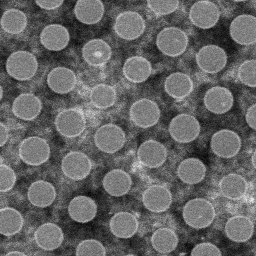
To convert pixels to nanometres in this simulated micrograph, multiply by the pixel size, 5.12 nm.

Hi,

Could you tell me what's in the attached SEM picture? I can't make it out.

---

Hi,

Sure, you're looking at a regular array of raised bodies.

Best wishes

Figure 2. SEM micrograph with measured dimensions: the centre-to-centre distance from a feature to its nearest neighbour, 218 nm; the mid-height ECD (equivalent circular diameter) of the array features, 138 nanometers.